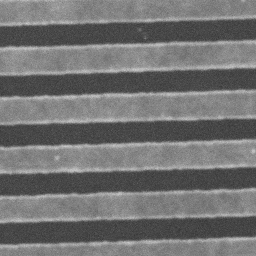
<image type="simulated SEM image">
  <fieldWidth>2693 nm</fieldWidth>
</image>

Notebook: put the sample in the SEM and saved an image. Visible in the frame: lines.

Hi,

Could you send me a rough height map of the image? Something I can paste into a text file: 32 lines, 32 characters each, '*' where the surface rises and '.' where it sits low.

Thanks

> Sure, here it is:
********************************
********************************
***********************.........
................................
................................
...................*************
********************************
********************************
*****************************...
................................
................................
...........................*****
********************************
********************************
********************************
**..............................
................................
...............................*
.*******************************
********************************
********************************
*****...........................
................................
................................
....****************************
********************************
********************************
**********......................
................................
................................
.......*************************
********************************